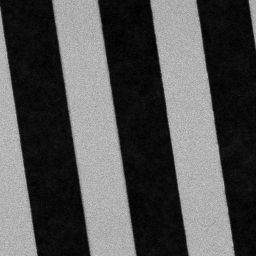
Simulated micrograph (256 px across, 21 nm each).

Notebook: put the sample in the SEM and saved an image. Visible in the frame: one or a few lines or trenches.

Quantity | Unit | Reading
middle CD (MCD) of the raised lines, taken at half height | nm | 1120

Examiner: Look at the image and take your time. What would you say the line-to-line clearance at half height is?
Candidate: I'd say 923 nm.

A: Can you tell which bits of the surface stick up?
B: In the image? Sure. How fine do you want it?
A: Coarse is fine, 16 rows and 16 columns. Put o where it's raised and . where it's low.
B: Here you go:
ooo...oooo..oooo
oooo..oooo..oooo
oooo..oooo...ooo
oooo...ooo...ooo
.ooo...ooo...ooo
.ooo...ooo...ooo
.ooo...ooo...ooo
.ooo...oooo..ooo
.oooo..oooo..ooo
.oooo...ooo...oo
.oooo...ooo...oo
..ooo...ooo...oo
..ooo...ooo...oo
..ooo...ooo...oo
..ooo...oooo..oo
..oooo..oooo...o